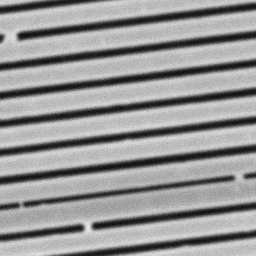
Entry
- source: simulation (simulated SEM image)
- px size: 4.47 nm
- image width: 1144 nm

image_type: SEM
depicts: parallel lines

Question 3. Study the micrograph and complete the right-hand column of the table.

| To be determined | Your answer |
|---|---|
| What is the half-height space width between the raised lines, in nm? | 38.9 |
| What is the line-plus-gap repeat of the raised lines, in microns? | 0.126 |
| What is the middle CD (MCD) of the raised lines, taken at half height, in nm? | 85.4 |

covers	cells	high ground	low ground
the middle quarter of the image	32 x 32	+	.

++++++++++++++++++++++++++++++++
++++++++++++++++++++++++.+......
++++++++++++++++++..............
++++++++++...................+++
++...................+++++++++++
.............+++++++++++++++++++
.....+++++++++++++++++++++++++++
++++++++++++++++++++++++++++++++
++++++++++++++++++++++++++......
++++++++++++++++++..............
++++++++++...................+++
++...................+++++++++++
.............+++++++++++++++++++
.....+++++++++++++++++++++++++++
++++++++++++++++++++++++++++++++
++++++++++++++++++++++++++++....
++++++++++++++++++..............
++++++++++....................++
++.....................+++++++++
...............+++++++++++++++++
.......+++++++++++++++++++++++++
++++++++++++++++++++++++++++++++
++++++++++++++++++++++++++++....
++++++++++++++++++++............
++++++++++++...................+
++++...................+++++++++
...............+++++++++++++++++
.......+++++++++++++++++++++++++
++++++++++++++++++++++++++++++++
+++++++++++++++++++++++++++++...
++++++++++++++++++++++.........+
++++++++++++++..........++++++++